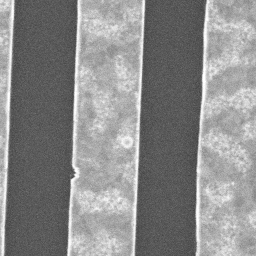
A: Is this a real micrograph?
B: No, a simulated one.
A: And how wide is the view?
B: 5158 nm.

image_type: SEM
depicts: one or a few lines or trenches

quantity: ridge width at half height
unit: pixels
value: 65.5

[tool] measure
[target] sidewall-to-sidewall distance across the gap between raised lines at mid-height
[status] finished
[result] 1290 nm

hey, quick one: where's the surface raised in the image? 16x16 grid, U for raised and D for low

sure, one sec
UDDDDUUUUDDDDUUU
UDDDDUUUUDDDDUUU
UDDDDUUUUDDDDUUU
UDDDDUUUUDDDDUUU
UDDDDUUUUDDDDUUU
UDDDDUUUUDDDDUUU
UDDDDUUUUDDDDUUU
UDDDDUUUUDDDDUUU
DDDDDUUUUDDDUUUU
DDDDDUUUUDDDUUUU
DDDDDUUUUDDDUUUU
DDDDDUUUUDDDUUUU
DDDDUUUUDDDDUUUU
DDDDUUUUDDDDUUUU
DDDDUUUUDDDDUUUU
DDDDUUUUDDDDUUUU